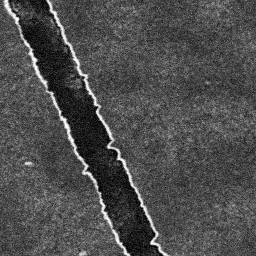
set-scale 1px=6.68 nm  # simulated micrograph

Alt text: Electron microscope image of one or a few lines or trenches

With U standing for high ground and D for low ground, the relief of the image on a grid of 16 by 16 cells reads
UDDUUUUUUUUUUUUU
UDDDUUUUUUUUUUUU
UUDDUUUUUUUUUUUU
UUDDDUUUUUUUUUUU
UUDDDUUUUUUUUUUU
UUUDDDUUUUUUUUUU
UUUUDDUUUUUUUUUU
UUUUDDUUUUUUUUUU
UUUUDDDUUUUUUUUU
UUUUUDDUUUUUUUUU
UUUUUDDDUUUUUUUU
UUUUUUDDUUUUUUUU
UUUUUUDDDUUUUUUU
UUUUUUUDDUUUUUUU
UUUUUUUDDDUUUUUU
UUUUUUUUDDUUUUUU